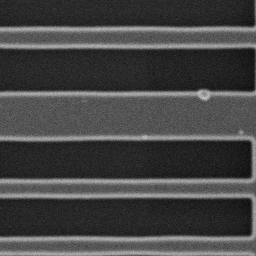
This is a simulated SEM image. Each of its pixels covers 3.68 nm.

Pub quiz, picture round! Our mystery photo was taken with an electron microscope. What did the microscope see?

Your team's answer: groups of lines, slits or small figures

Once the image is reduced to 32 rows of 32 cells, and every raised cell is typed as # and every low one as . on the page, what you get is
................................
................................
................................
...............................#
################################
################################
................................
................................
................................
................................
................................
.........................#......
################################
################################
################################
################################
################################
...............................#
................................
................................
................................
................................
...............................#
################################
################################
................................
................................
................................
................................
...............................#
################################
################################